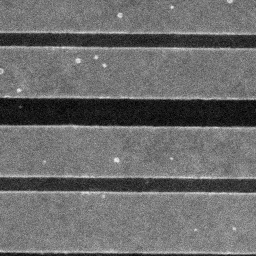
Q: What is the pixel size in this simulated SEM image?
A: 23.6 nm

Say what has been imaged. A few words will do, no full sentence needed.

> lines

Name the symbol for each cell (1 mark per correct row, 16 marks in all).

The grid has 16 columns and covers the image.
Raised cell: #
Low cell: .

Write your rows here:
################
################
################
################
################
################
................
................
################
################
################
################
################
################
################
################